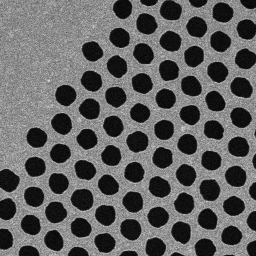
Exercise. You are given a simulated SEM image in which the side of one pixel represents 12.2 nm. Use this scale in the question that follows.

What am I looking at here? a regular array of holes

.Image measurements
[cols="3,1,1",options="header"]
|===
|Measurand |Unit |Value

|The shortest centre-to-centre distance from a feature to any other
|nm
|345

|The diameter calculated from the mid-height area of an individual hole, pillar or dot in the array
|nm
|253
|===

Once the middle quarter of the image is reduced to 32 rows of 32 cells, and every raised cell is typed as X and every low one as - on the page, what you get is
XXXXXXXXXXX-----XXXXXXXX----XXX-
XXXXXXXXXXX-----XXXXXXXX-----XXX
XXXXX----XXX---XXX---XXX-----XXX
XXXX-----XXXX-XXX-----XX----XX--
XXXX------XXXXXXX-----XXXXXXX---
-XXXX----XXXXXXXX-----XXXXXXX---
---XXX---XX----XXX----XX--XXXX--
---XXXXXXX-----XXXXXXXX-----XX--
---XXXXXXX------XXXXXXX-----XXXX
--XXX---XXX----XXXXXXXX-----XXXX
-XXX-----XXX--XXX---XXXX---XXX--
XXXX-----XXXXXXXX----XXXXXXXX---
-XXX-----XXXXXXXX-----XXXXXXX---
--XXX---XXX---XXX----XXXXXXXX---
--XXXXXXXX-----XXX--XXXX---XXX--
--XXXXXXXX-----XXXXXXXX----XXXXX
--XX---XXX-----XXXXXXXX----XXXXX
-XXX----XXX---XXX---XXX----XXX-X
XXX-----XXXXXXXX-----XX---XXX---
XXX-----XXXXXXXX-----XXXXXXX----
-XXX----XXX--XXX-----XXXXXXX----
-XXXXXXXXX----XXX---XXX---XXX---
--XXXXXXX-----XXXXXXXX-----XXX--
-XXXXXXXX-----XXXXXXXX-----XXXXX
XXX---XXXX----XXX-XXXX-----XXXXX
XXX-----XXXXXXXX----XXX---XXX---
XXX-----XXXXXXX-----XXXXXXXX----
XXX-----XXXXXXX-----XXXXXXXX----
-XXX---XX---XXX-----XX--XXXX----
-XXXXXXXX----XXXX--XX-----XXX---
-XXXXXXX------XXXXXXX------XXX-X
XXX---XXX-----XXXXXXX------XXXXX